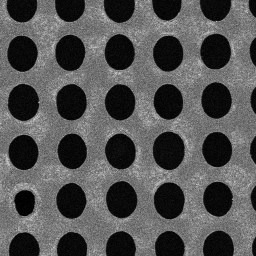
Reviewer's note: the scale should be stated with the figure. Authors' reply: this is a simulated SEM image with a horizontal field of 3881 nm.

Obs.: a regular array of holes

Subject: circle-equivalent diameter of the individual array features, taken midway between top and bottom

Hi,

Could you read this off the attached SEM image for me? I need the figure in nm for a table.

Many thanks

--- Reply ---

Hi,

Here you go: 503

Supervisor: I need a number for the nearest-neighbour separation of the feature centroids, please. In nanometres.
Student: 729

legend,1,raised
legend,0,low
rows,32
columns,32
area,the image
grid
10000110000110000110000110000110
10001110001110000110001110000110
11001111001111001111111111001111
11111111111111111111111111111111
11111111011111001111111111001111
10001110001110000110000110000110
10000110000110000110000110000110
10000110001110000110000110000110
11001111001111001111001111001111
11111111111111111111111111111111
11111111111111111111111111001111
10000110000111000110000110000111
10000110000110000110000110000110
10000110000110000110000110000110
11001111001111001111001111001111
11111111111111111111111111111111
11111111111111111111101111111111
11001111001111001110000111000111
10000110000110000110000110000110
10000110000110000110000110000110
11001111001111001111000111001111
11111111111111111111111111111111
11111111111111111111111111111111
11111111001111000111000111000111
11001110000110000110000110000110
11001110000110000110000110000110
11001111001111000111000111001111
11111111111111111111111111111111
11111111111111111111111111111111
11001111001111001111001111000111
10000110000110000110000110000111
10000110000110000110000110000111